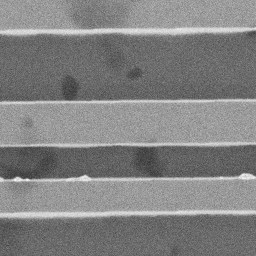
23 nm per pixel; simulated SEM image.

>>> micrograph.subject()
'lines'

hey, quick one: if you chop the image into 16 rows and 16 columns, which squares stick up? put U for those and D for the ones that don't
UUUUUUUUUUUUUUUU
UUUUUUUUUUUUUUUU
DDDDDDDDDDDDDDDD
DDDDDDDDDDDDDDDD
DDDDDDDDDDDDDDDD
DDDDDDDDDDDDDDDD
UUUUUUUUUUUUUUUU
UUUUUUUUUUUUUUUU
UUUUUUUUUUUUUUUU
DDDDDDDDDDDDDDDD
DDDDDDDDDDDDDDDD
UUUUUUUUUUUUUUUU
UUUUUUUUUUUUUUUU
DDDDDDDDDDDDDDDD
DDDDDDDDDDDDDDDD
DDDDDDDDDDDDDDDD